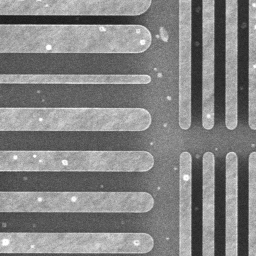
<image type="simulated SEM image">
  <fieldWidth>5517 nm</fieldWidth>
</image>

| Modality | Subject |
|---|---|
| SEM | groups of lines, slits or small figures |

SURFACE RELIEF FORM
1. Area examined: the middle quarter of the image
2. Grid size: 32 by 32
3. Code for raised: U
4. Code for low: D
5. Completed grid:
DDDDDDDDDDDDDDDDDDDDDDDDDDDDDUUD
DDDDDDDDDDDDDDDDDDDDDDDDDDDDDUUD
DDDDDDDDDDDDDDDDDDDDDDDDDDDDDUUD
UUUUUUUUUUUUUUUUUUUUUUDDDDDDDUUD
UUUUUUUUUUUUUUUUUUUUUDDDDDDDDUUD
DDDDDDDDDDDDDDDDDDDDDDDDDDDDDUUD
DDDDDDDDDDDDDDDDDDDDDDDDDDDDDUUD
DDDDDDDDDDDDDDDDDDDDDDDDDDDDDUUD
DDDDDDDDDDDDDDDDDDDDDDDDDDDDDUUD
DDDDDDDDDDDDDDDDDDDDDDDDDDDDDUUD
DDDDDDDDDDDDDDDDDDDDDDDDDDDDDUUD
UUUUUUUUUUUUUUUUUUUUDDDDDDDDDUUD
UUUUUUUUUUUUUUUUUUUUUDDDDDDDDUUD
UUUUUUUUUUUUUUUUUUUUUUDDDDDDDUUD
UUUUUUUUUUUUUUUUUUUUUUDDDDDDDUUD
UUUUUUUUUUUUUUUUUUUUUDDDDDDDDUUD
DDDDDDDDDDDDDDDDDDDDDDDDDDDDDDDD
DDDDDDDDDDDDDDDDDDDDDDDDDDDDDDDD
DDDDDDDDDDDDDDDDDDDDDDDDDDDDDDDD
DDDDDDDDDDDDDDDDDDDDDDDDDDDDDDDD
DDDDDDDDDDDDDDDDDDDDDDDDDDDDDDDD
DDDDDDDDDDDDDDDDDDDDDDDDDDDDDDDD
UUUUUUUUUUUUUUUUUUUUUUDDDDDDDUUD
UUUUUUUUUUUUUUUUUUUUUUDDDDDDDUUU
UUUUUUUUUUUUUUUUUUUUUUDDDDDDDUUU
UUUUUUUUUUUUUUUUUUUUUUDDDDDDDUUU
UUUUUUUUUUUUUUUUUUUUUDDDDDDDDUUU
DDDDDDDDDDDDDDDDDDDDDDDDDDDDDUUU
DDDDDDDDDDDDDDDDDDDDDDDDDDDDDUUU
DDDDDDDDDDDDDDDDDDDDDDDDDDDDDUUU
DDDDDDDDDDDDDDDDDDDDDDDDDDDDDUUU
DDDDDDDDDDDDDDDDDDDDDDDDDDDDDUUU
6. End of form